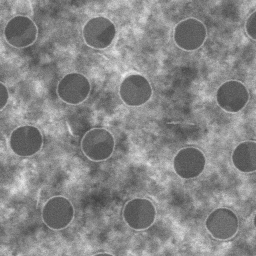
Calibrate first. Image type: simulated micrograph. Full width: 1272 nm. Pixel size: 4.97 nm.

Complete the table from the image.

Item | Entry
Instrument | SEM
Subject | a regular array of raised bodies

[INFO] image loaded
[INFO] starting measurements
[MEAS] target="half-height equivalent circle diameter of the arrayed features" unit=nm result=166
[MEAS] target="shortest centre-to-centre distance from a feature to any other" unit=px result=70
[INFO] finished